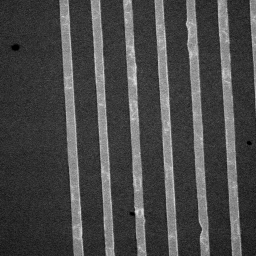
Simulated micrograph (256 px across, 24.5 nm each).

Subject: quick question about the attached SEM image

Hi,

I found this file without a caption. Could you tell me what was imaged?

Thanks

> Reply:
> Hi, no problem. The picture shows parallel lines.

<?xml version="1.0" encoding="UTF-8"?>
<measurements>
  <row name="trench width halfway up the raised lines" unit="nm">578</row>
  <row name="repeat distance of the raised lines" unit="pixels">31.6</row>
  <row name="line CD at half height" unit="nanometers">202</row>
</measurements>